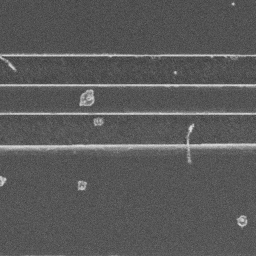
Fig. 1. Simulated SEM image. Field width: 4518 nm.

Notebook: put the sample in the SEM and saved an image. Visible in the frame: lines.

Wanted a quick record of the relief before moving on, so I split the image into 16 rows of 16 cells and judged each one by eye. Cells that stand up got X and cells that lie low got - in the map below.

XXXXXXXXXXXXXXXX
XXXXXXXXXXXXXXXX
XXXXXXXXXXXXXXXX
X---------------
----------------
XXXXXXXXXXXXXXXX
XXXXXXXXXXXXXXXX
----------------
----------------
XXXXXXXXXXXXXXXX
XXXXXXXXXXXXXXXX
XXXXXXXXXXXXXXXX
XXXXXXXXXXXXXXXX
XXXXXXXXXXXXXXXX
XXXXXXXXXXXXXXXX
XXXXXXXXXXXXXXXX